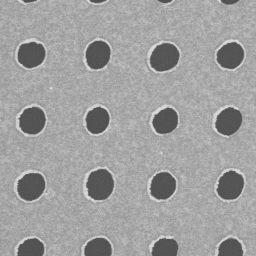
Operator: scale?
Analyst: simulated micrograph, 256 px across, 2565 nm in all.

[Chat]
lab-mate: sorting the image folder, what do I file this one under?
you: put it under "a regular array of holes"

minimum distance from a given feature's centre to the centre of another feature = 644 nanometres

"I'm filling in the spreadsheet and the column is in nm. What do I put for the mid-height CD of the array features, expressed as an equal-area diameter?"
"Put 271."